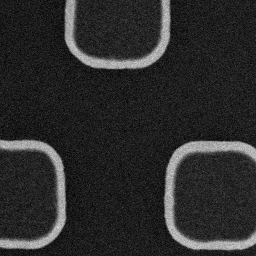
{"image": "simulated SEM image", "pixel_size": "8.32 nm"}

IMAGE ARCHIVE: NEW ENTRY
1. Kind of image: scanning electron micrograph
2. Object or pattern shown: raised bodies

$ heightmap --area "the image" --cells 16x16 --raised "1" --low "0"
0000111111000000
0000111111000000
0000111111000000
0000011111000000
0000000000000000
0000000000000000
0000000000000000
0000000000000000
0000000000000000
1110000000011111
1111000000011111
1111000000011111
1111000000011111
1111000000011111
1110000000011111
0000000000000000